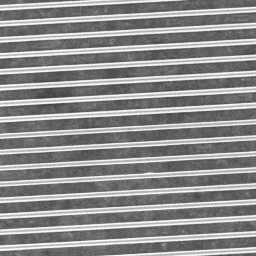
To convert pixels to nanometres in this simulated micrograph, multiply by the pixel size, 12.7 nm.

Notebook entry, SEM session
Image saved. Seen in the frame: parallel lines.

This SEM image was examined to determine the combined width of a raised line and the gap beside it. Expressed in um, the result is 0.203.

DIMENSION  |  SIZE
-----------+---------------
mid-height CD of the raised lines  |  0.0475 µm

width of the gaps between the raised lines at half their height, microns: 0.155